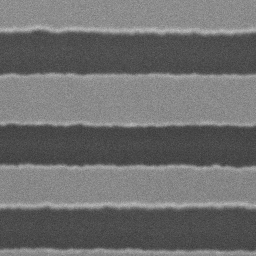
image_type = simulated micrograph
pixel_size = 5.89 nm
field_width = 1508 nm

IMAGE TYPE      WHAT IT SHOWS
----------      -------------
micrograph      lines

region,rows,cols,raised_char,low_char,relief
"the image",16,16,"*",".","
****************
****************
................
................
................
****************
****************
****************
................
................
**************.*
****************
****************
................
................
................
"